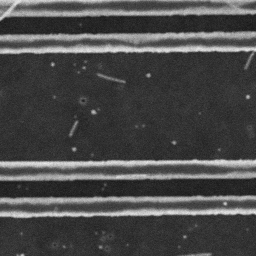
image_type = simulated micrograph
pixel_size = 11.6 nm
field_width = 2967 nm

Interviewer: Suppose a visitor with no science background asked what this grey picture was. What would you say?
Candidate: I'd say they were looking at lines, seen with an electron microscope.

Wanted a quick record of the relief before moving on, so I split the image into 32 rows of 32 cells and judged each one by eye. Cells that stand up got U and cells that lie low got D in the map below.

UUUUUUUUUUUUUUUUUUUUUUUUUUUUUUUU
UUUUUUUUUUUUUUUUUUUUUUUUUUUUUUUU
DDDDDDDDDDDDDDDDDDDDDDDDDDDDDDDD
DDDDDDDDDDDDDDDDDDDDDDDDDDDDDDDD
DDDDDDUUDDUUUUUUUDUUUUUUUUUUUUUU
UUUUUUUUUUUUUUUUUUUUUUUUUUUUUUUU
UUUDUUDDDDDDDDDDDDDDDDDDDDDDDDDD
DDDDDDDDDDDDDDDDDDDDDDDDDDDDDDDD
DDDDDDDDDDDDDDDDDDDDDDDDDDDDDDDD
DDDDDDDDDDDDDDDDDDDDDDDDDDDDDDDD
DDDDDDDDDDDDDDDDDDDDDDDDDDDDDDDD
DDDDDDDDDDDDDDDDDDDDDDDDDDDDDDDD
DDDDDDDDDDDDDDDDDDDDDDDDDDDDDDDD
DDDDDDDDDDDDDDDDDDDDDDDDDDDDDDDD
DDDDDDDDDDDDDDDDDDDDDDDDDDDDDDDD
DDDDDDDDDDDDDDDDDDDDDDDDDDDDDDDD
DDDDDDDDDDDDDDDDDDDDDDDDDDDDDDDD
DDDDDDDDDDDDDDDDDDDDDDDDDDDDDDDD
DDDDDDDDDDDDDDDDDDDDDDDDDDDDDDDD
DDDDDDDDDDDDDDDDDDDDDDDDDDDDDDDD
UUUUUUUUUUUUUUUUUUUUUUUUUUUUUUUU
UUUUUUUUUUUUUUUUUUUUUUUUUUUUUUUU
DUDDDDDDDDDDDDDDDDDDDDDDDDDDDDDD
DDDDDDDDDDDDDDDDDDDDDDDDDDDDDDDD
DDDDDDDDDDDDDDDDDDDDDDDDDDDDDDDD
UUUUUUUUUUUUUUUUUUUUUUUUUUUUUUUU
UUUUUUUUUUUUUUUUUUUUUUUUUUUUUUUU
DDDDDDDDDDDDDDDDDDDDDDDDDDDDDDDD
DDDDDDDDDDDDDDDDDDDDDDDDDDDDDDDD
DDDDDDDDDDDDDDDDDDDDDDDDDDDDDDDD
DDDDDDDDDDDDDDDDDDDDDDDDDDDDDDDD
DDDDDDDDDDDDDDDDDDDDDDDDDDDDDDDD